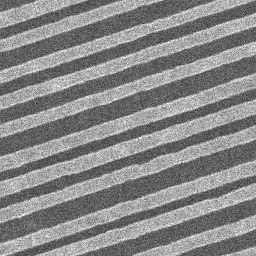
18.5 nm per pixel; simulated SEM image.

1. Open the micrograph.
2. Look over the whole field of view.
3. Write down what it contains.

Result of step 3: parallel lines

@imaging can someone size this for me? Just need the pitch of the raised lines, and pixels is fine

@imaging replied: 27.2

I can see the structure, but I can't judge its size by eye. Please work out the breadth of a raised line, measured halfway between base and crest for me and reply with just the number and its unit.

213 nanometres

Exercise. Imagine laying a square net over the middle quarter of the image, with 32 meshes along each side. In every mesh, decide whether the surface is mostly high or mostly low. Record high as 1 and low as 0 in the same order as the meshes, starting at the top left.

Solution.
00000000111111111000000000000111
00000111111111000000000000011111
00111111111000000000000011111111
11111111000000000000111111111000
11111000000000000111111111000000
11000000000000111111111000000000
00000000000011111110000000000000
00000000011111110000000000000000
00000111111111100000000000000011
00111111111100000000000000011111
11111111000000000000000011111111
11111000000000000000111111111110
11000000000000000011111111110000
00000000000000111111111100000000
00000000000111111111110000000001
00000000111111111100000000011111
00000011111111100000000001111111
00011111111110000000001111111111
11111111110000000001111111111100
11111100000000001111111111000000
11100000000011111111111000000000
00000000001111111111000000000011
00000001111111111000000000011111
00001111111111000000000111111111
11111111111000000000011111111100
11111111000000000011111111100000
11111000000000111111111100000000
10000000000111111111110000000000
00000000011111111100000000000000
00000111111111100000000000000000
00111111111100000000000000001111
11111111100000000000000001111111